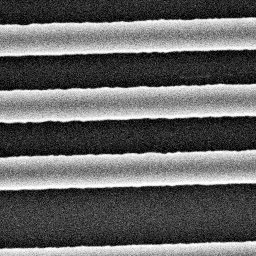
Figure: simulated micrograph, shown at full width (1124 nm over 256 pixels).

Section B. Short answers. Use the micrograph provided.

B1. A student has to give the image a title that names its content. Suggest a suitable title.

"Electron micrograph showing lines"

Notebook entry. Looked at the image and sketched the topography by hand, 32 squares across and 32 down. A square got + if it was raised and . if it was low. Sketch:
................................
................................
....................+++.++++++++
++++++++++++++++++++++++++++++++
++++++++++++++++++++++++++++++++
++++++++++++++++++++++++++++++++
+++++++++++++++++++.+...........
................................
................................
................................
................................
++++++++++++++++++++++++++++++++
++++++++++++++++++++++++++++++++
++++++++++++++++++++++++++++++++
++++++++++++++++++++++++++++....
................................
................................
................................
................................
......++.+++++++++++++++++++++++
++++++++++++++++++++++++++++++++
++++++++++++++++++++++++++++++++
++++++++++++++++++++++++++++++++
++++++..........................
................................
................................
................................
................................
................................
................................
......................+.++++++++
++++++++++++++++++++++++++++++++